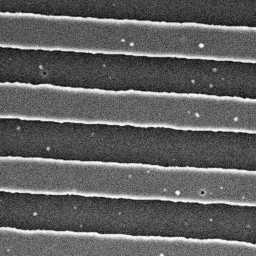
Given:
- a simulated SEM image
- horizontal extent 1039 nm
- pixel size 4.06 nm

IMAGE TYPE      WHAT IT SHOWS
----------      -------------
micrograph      lines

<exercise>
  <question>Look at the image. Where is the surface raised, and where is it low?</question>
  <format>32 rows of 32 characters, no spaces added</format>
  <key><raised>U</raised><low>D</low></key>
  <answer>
DDDDDDDDDDDDDDDDDDDDDDDDDDDDDDDD
DDDDDDDDDDDDDDDDDDDDDDDDDDDDDDDD
UUUUUUUUUUUUUUUDDDDDDDDDDDDDDDDD
UUUUUUUUUUUUUUUUUUUUUUUUUUUUUUUU
UUUUUUUUUUUUUUUUUUUUUUUUUUUUUUUU
UUUUUUUUUUUUUUUUUUUUUUUUUUUUUUUU
DDDDDDDDDDDUUUUUUUUUUUUUUUUUUUUU
DDDDDDDDDDDDDDDDDDDDDDDDDDDDDUUU
DDDDDDDDDDDDDDDDDDDDDDDDDDDDDDDD
DDDDDDDDDDDDDDDDDDDDDDDDDDDDDDDD
UUUUDDDDDDDDDDDDDDDDDDDDDDDDDDDD
UUUUUUUUUUUUUUUUUUDDDDDDDDDDDDDD
UUUUUUUUUUUUUUUUUUUUUUUUUUUUUUUU
UUUUUUUUUUUUUUUUUUUUUUUUUUUUUUUU
UUUUUUUUUUUUUUUUUUUUUUUUUUUUUUUU
DDDDDDDDDDDDDUUUUUUUUUUUUUUUUUUU
DDDDDDDDDDDDDDDDDDDDDDDDDDDDDDDU
DDDDDDDDDDDDDDDDDDDDDDDDDDDDDDDD
DDDDDDDDDDDDDDDDDDDDDDDDDDDDDDDD
DDDDDDDDDDDDDDDDDDDDDDDDDDDDDDDD
UUUUUUUUUUUUUUUUUUDDDDDDDDDDDDDD
UUUUUUUUUUUUUUUUUUUUUUUUUUUUUUUU
UUUUUUUUUUUUUUUUUUUUUUUUUUUUUUUU
UUUUUUUUUUUUUUUUUUUUUUUUUUUUUUUU
DDDDDDDDDDUUUUUUUUUUUUUUUUUUUUUU
DDDDDDDDDDDDDDDDDDDDDDDDDDDDDUUU
DDDDDDDDDDDDDDDDDDDDDDDDDDDDDDDD
DDDDDDDDDDDDDDDDDDDDDDDDDDDDDDDD
UDDDDDDDDDDDDDDDDDDDDDDDDDDDDDDD
UUUUUUUUUUUUUUUUUDDDDDDDDDDDDDDD
UUUUUUUUUUUUUUUUUUUUUUUUUUUUUUUD
UUUUUUUUUUUUUUUUUUUUUUUUUUUUUUUU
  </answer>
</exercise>